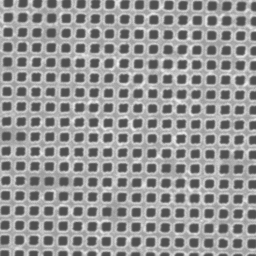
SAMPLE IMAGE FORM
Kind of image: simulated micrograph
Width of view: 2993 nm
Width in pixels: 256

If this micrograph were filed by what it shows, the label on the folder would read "a regular array of holes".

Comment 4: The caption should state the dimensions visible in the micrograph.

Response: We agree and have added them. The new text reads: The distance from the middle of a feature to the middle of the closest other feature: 0.167 µm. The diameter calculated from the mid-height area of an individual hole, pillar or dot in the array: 124 nanometres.